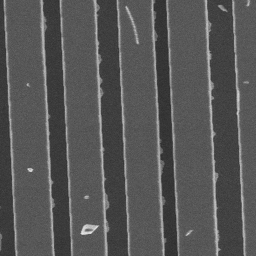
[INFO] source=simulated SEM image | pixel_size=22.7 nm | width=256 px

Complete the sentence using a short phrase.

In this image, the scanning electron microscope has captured lines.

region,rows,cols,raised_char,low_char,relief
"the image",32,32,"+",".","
.++++...++++...++++..+++++...+++
.++++...++++...++++..+++++...+++
.++++...++++...++++..+++++...+++
.++++...++++...++++..+++++...+++
.+++++..++++...++++..+++++...+++
.+++++..++++...++++..+++++...+++
.+++++..++++...++++..+++++...+++
.+++++..++++...++++..+++++...+++
.+++++..++++...++++..+++++...+++
.+++++..++++...+++++.+++++....++
.+++++..++++...+++++.+++++....++
.+++++..++++...+++++.+++++....++
.+++++..+++++..+++++.+++++....++
.+++++..+++++..+++++.+++++....++
.+++++..+++++..+++++.+++++....++
.+++++..+++++..+++++..++++....++
.+++++..+++++..+++++..+++++...++
.+++++..+++++...++++..+++++...++
.+++++..+++++...++++..+++++...++
.+++++..+++++...++++..+++++...++
.+++++...++++...++++..+++++...++
.+++++...++++...++++..+++++...++
..++++...++++...++++..+++++...++
..++++...++++...++++..+++++...++
..++++...++++...++++..+++++...++
..++++...++++...++++..+++++...++
..++++...++++...++++..+++++...++
..+++++..++++...++++..+++++...++
..+++++..++++...++++..+++++...++
..+++++..++++...++++..+++++....+
..+++++..++++...++++..+++++....+
..+++++..++++...++++..+++++....+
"